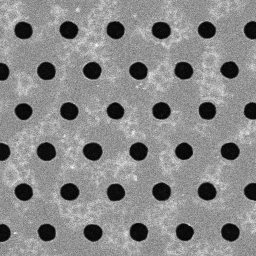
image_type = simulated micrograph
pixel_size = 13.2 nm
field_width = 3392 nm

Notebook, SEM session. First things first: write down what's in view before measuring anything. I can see a regular array of holes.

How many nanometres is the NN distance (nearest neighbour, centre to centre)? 603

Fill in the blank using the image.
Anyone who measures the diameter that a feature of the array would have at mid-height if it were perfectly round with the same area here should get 240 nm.